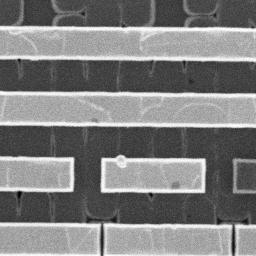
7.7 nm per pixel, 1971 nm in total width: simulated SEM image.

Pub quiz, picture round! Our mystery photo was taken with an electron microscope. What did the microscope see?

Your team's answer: wiring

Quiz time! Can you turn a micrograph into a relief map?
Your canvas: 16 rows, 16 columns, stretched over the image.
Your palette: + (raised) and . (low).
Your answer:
................
................
++++++++++++++++
++++++++++++++++
................
................
++++++++++++++++
++++++++++++++++
................
................
++++..+++++++..+
++++..+++++++..+
................
................
++++++++++++++++
++++++++++++++++